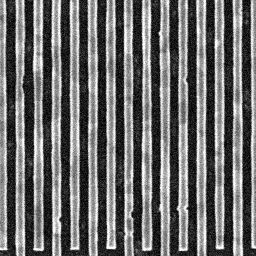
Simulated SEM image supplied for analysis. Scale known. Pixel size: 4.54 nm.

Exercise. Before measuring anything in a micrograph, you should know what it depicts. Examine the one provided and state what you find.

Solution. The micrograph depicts parallel lines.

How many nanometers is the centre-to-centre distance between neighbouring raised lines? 82.2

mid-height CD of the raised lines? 34.6 nm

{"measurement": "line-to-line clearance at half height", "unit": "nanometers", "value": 47.6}